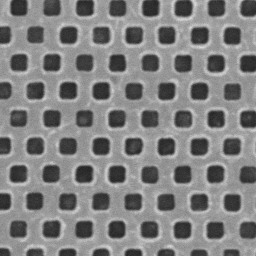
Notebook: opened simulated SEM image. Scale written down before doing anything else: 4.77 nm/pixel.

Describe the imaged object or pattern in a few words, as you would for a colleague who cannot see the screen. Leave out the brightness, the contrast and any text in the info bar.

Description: a regular array of holes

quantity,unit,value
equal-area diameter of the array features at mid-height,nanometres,92.4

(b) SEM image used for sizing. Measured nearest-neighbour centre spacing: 152 nanometres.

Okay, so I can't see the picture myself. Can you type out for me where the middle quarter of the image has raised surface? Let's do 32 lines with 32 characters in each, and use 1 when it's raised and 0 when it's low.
11100000111000001110000011100000
11100001111000011111000011110000
11111111111111111111111111111111
11111111111111111111111111111111
00111111100111110001111110011111
00011110000111100000111100001111
00011110000011100000111000001111
00011110000011100000111000001111
00011110000111100000111000011111
11111111111111111111111111111111
11111111111111111111111111111111
11110001111110111111100111111001
11100000111000011110000011110000
11100000111000001110000011100000
11100001111000011110000011100000
11100001111000011111000111110000
11111111111111111111111111111111
11111111111111111111111111111111
00111111001111110001111100011111
00011110000111100000111000001111
00011110000011100000111000001111
00011110000111100000111000001111
00011110000111100001111000011111
11111111111111111111111111111111
11111111111111111111111111111111
11110001111100011111011111111001
11100001111000001110000011110000
11100001111000001110000011100000
11100001111000001110000011100000
11100001111000011110000111110001
11111111111111111111111111111111
11111111111111111111111111111111